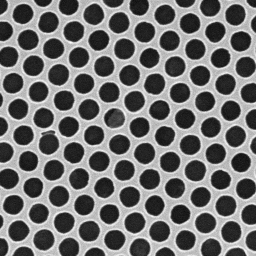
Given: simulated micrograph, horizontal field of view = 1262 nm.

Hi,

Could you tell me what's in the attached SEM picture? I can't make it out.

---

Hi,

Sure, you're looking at a regular array of holes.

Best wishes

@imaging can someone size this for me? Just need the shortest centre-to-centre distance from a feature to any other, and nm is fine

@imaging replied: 130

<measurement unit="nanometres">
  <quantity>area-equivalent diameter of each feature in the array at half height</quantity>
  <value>104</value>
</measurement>